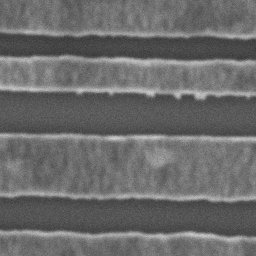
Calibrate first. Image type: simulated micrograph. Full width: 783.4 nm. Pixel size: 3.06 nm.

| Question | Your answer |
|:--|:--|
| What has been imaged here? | lines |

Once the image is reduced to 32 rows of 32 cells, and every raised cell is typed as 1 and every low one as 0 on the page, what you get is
11111111111111111111111111111111
11111111111111111111111111111111
11111111111111111111111111111111
11111111111111111111111111111111
00000000010000001111111100011111
00000000000000000000000000000000
00000000000000000000000000000000
11111111111111111011000000000000
11111111111111111111111111111111
11111111111111111111111111111111
11111111111111111111111111111111
00000000000000000111111111111111
00000000000000000000000000000000
00000000000000000000000000000000
00000000000000000000000000000000
00000000000000000000000000000000
00000000000000000000000000000000
11111111111111111111111111111111
11111111111111111111111111111111
11111111111111111111111111111111
11111111111111111111111111111111
11111111111111111111111111111111
11111111111111111111111111111111
11111111111111111111111111111111
01000000111111111111111111111111
00000000000000000000000000000000
00000000000000000000000000000000
00000000000000000000000000000000
00000000000000000000000000000000
11111111111111111111111111100000
11111111111111111111111111111111
11111111111111111111111111111111